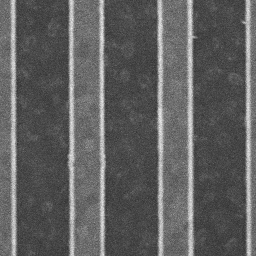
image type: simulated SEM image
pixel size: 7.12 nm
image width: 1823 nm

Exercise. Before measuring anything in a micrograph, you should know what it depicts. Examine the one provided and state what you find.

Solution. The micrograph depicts one or a few lines or trenches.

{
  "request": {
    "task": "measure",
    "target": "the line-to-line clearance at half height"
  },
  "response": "412 nanometres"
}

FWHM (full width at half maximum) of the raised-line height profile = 216 nm